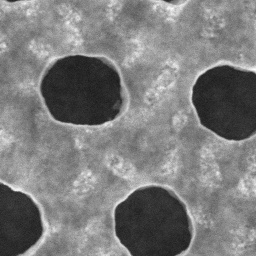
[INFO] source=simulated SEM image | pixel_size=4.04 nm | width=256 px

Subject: holes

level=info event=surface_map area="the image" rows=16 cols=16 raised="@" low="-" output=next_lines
@@@@@@@@@@@@@@@@
@@@@@@@@@@@@@@@@
@@@@@@@@@@@@@@@@
@@@@-@@@@@@@@@@@
@@@----@@@@@@---
@@@-----@@@@----
@@@-----@@@@----
@@@@---@@@@@@---
@@@@@@@@@@@@@@--
@@@@@@@@@@@@@@@@
@@@@@@@@@@@@@@@@
@@@@@@@@@@@@@@@@
--@@@@@@---@@@@@
---@@@@-----@@@@
---@@@@-----@@@@
--@@@@@@----@@@@